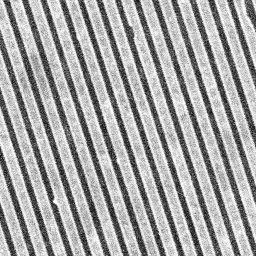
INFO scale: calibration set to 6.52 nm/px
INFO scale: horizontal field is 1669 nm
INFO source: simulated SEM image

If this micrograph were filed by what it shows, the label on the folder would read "parallel lines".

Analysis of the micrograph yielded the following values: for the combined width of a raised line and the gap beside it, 0.116 µm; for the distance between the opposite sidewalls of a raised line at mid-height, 64.4 nanometres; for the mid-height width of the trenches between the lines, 0.0519 micrometres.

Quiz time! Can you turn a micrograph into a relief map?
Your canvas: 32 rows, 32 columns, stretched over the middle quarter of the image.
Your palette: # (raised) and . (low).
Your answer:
.###..##..###..###..##...##..###
..##..###..##..###..###..##...##
..##...##..###..##..###..###..##
..###..##..###..###..##..###..##
...##..###..##..###..###..##..##
#..##...##..###..##..###..###..#
#..###..##..###..###..##..###..#
#...##..###..##..###..###..##..#
##..##...##..###..##..###..###..
##..###..##..###..###..##..###..
##...##..###..##..###..###..##..
###..##...##..###..##..###..###.
.##..###..##..###..###..##..###.
.##...##..###..##..###..###..##.
.###..##...##..###..##..###..###
..##..###..##..###..###..##..###
..##...##..###..##..###..###..##
..###..##...##..###..##..###..##
...##..###..##..###..###..##..##
#..##...##..###..##..###..###..#
#..###..##...##..###..##..###..#
#...##..###..##..###..###..##..#
#...##...##..###..##..###..###..
##..##...##...##..###..##..###..
##..###..##...##..###..###..##..
##...##..###..##...##..###..###.
###..##...##..###..##...##..###.
.##..###..##...##..###..##...##.
.##...##..###..##...##..###..##.
.###..##...##..###..##...##..###
..##..###..##...##..###..##...##
..##...##..###..##...##..###..##